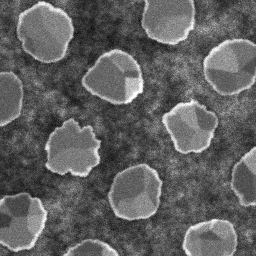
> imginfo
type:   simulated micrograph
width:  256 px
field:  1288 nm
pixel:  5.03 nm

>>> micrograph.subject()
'raised bodies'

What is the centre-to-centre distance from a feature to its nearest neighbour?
0.416 micrometres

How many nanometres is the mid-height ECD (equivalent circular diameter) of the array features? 268